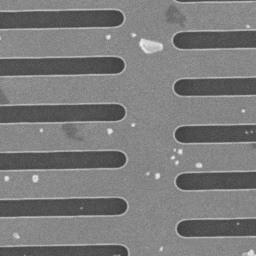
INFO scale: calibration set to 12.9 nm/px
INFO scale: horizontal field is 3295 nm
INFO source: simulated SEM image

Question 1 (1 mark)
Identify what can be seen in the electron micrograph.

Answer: groups of lines, slits or small figures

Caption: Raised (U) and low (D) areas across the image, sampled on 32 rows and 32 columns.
UUUUUUUUUUUUUUUUUUUUUUUUUUUUUUUU
DDDDDDDDDDDDDDDUUUUUUUUUUUUUUUUU
DDDDDDDDDDDDDDDUUUUUUUUUUUUUUUUU
DDDDDDDDDDDDDDUUUUUUUUUUUUUUUUUU
UUUUUUUUUUUUUUUUUUUUUUDDDDDDDDDD
UUUUUUUUUUUUUUUUUUUUUUDDDDDDDDDD
UUUUUUUUUUUUUUUUUUUUUUUUUUUUUUUU
DDDDDDDDDDDDDDDUUUUUUUUUUUUUUUUU
DDDDDDDDDDDDDDDUUUUUUUUUUUUUUUUU
DDDDUUUUUUUUUUUUUUUUUUUUUUUUUUUU
UUUUUUUUUUUUUUUUUUUUUUDDDDDDDDDD
UUUUUUUUUUUUUUUUUUUUUUDDDDDDDDDD
UUUUUUUUUUUUUUUUUUUUUUUUUUUUUUUU
DDDDDDDDDDDDDDDUUUUUUUUUUUUUUUUU
DDDDDDDDDDDDDDDDUUUUUUUUUUUUUUUU
DDUUUUUUUUUUUUUUUUUUUUUUUUUUUUDD
UUUUUUUUUUUUUUUUUUUUUUDDDDDDDDDD
UUUUUUUUUUUUUUUUUUUUUUDDDDDDDDDD
UUUUUUUUUUUUUUUUUUUUUUUUUUUUUUUU
DDDDDDDDDDDDDDDDUUUUUUUUUUUUUUUU
DDDDDDDDDDDDDDDDUUUUUUUUUUUUUUUU
UUUUUUUUUUUUUUUUUUUUUUUUUUDDDDDD
UUUUUUUUUUUUUUUUUUUUUUDDDDDDDDDD
UUUUUUUUUUUUUUUUUUUUUUDDDDDDDDDD
UUUUUUUUUUUUUUUUUUUUUUUUUUUUUUUU
DDDDDDDDDDDDDDDDUUUUUUUUUUUUUUUU
DDDDDDDDDDDDDDDDUUUUUUUUUUUUUUUU
UUUUUUUUUUUUUUUUUUUUUUUDDDDDDDDD
UUUUUUUUUUUUUUUUUUUUUUDDDDDDDDDD
UUUUUUUUUUUUUUUUUUUUUUUDDDDDDDDD
UUUUUUUUUUUUUUUUUUUUUUUUUUUUUUUU
DDDDDDDDDDDDDDDDUUUUUUUUUUUUUUUU